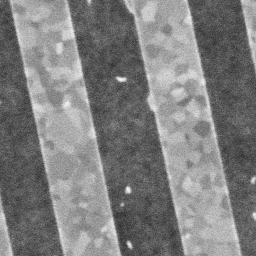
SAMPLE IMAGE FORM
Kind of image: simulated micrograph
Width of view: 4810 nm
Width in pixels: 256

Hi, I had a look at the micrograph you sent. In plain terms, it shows lines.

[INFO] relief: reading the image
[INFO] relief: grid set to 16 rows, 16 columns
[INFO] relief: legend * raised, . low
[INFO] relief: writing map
.***....****...*
.***.....***...*
.****....***....
.****....***....
..***....****...
..***....****...
..****....***...
..****....***...
..****....***...
...***....****..
...***....****..
...****....***..
...****....***..
...****....****.
....***....****.
*...***.....***.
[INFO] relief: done